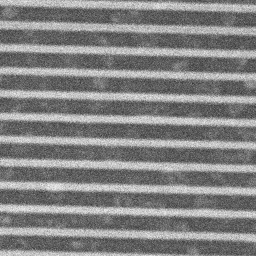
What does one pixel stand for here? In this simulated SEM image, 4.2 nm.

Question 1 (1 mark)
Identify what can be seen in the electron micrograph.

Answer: parallel lines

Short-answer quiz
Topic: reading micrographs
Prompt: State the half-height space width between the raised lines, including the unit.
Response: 74 nm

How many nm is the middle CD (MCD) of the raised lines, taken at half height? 23.6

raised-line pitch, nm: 96.1